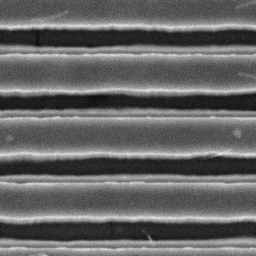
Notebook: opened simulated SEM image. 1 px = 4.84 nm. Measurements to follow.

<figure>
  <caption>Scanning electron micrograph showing lines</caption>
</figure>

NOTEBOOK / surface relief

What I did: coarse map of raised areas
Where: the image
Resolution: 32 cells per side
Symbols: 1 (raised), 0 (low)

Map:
11111111111111111111111111111111
11111111111111111111111111111111
11111111111111111111111111111111
11000000000000000000111100000000
00000000000000000000000000000000
00000000000000000000000000000000
11111111111111111111111111111111
11111111111111111111111111111111
11111111111111111111111111111111
11111111111111111111111111111111
11111111111111111111111111111111
00000000111000000000000000011000
00000000000000000000000000000000
00000000000000000000000000000000
11111111111111111111111111111111
11111111111111111111111111111111
11111111111111111111111111111111
11111111111111111111111111111111
11111111111111111111111111111111
00000000000000000000000000000000
00000000000000000000000000000000
00000000000000000000000000000000
11111111111111111111111111111111
11111111111111111111111111111111
11111111111111111111111111111111
11111111111111111111111111111111
11111111111111111111111111111111
00000000000000000000000000000000
00000000000000000000000000000000
00000000000000000000000000000000
11111111111111111111111111111111
11111111111111111111111111111111